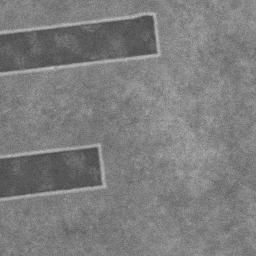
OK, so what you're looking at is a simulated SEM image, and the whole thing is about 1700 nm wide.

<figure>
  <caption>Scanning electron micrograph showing one or a few lines or trenches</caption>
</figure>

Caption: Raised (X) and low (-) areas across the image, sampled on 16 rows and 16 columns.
XXXXXXXXXXXXXXXX
XXXXX-----XXXXXX
----------XXXXXX
---------XXXXXXX
-XXXXXXXXXXXXXXX
XXXXXXXXXXXXXXXX
XXXXXXXXXXXXXXXX
XXXXXXXXXXXXXXXX
XXXXXXXXXXXXXXXX
XXX---XXXXXXXXXX
------XXXXXXXXXX
------XXXXXXXXXX
XXXXXXXXXXXXXXXX
XXXXXXXXXXXXXXXX
XXXXXXXXXXXXXXXX
XXXXXXXXXXXXXXXX